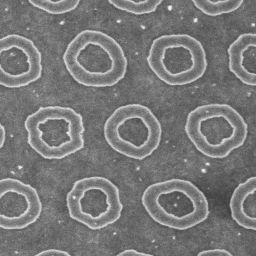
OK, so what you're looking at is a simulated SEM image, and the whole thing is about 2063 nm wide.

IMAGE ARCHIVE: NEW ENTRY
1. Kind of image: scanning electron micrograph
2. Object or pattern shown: ring-shaped raised bodies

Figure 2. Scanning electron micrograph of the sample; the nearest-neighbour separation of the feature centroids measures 0.65 µm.